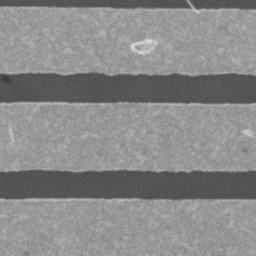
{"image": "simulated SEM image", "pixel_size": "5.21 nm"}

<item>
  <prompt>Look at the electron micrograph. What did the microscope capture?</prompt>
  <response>lines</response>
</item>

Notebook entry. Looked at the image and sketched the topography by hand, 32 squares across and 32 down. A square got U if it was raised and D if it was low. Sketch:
DDDDDDDDDDDDDDDDDDDDDDDDDDDDDDDD
UUUUUUUUUUUUUUUUUUUUUUUUUUUUUUUU
UUUUUUUUUUUUUUUUUUUUUUUUUUUUUUUU
UUUUUUUUUUUUUUUUUUUUUUUUUUUUUUUU
UUUUUUUUUUUUUUUUUUUUUUUUUUUUUUUU
UUUUUUUUUUUUUUUUUUUUUUUUUUUUUUUU
UUUUUUUUUUUUUUUUUUUUUUUUUUUUUUUU
UUUUUUUUUUUUUUUUUUUUUUUUUUUUUUUU
UUUUUUUUUUUUUUUUUUUUUUUUUUUUUUUU
DDDDDDDDDDDDDDDDDDDDDDDDDDDDDDDD
DDDDDDDDDDDDDDDDDDDDDDDDDDDDDDDD
DDDDDDDDDDDDDDDDDDDDDDDDDDDDDDDD
DDDDDDDDDDDDDDDDDDDDDDDDDDDDDDDD
UUUUUUUUUUUUUUUUUUUUUUUUUUUUUUUU
UUUUUUUUUUUUUUUUUUUUUUUUUUUUUUUU
UUUUUUUUUUUUUUUUUUUUUUUUUUUUUUUU
UUUUUUUUUUUUUUUUUUUUUUUUUUUUUUUU
UUUUUUUUUUUUUUUUUUUUUUUUUUUUUUUU
UUUUUUUUUUUUUUUUUUUUUUUUUUUUUUUU
UUUUUUUUUUUUUUUUUUUUUUUUUUUUUUUU
UUUUUUUUUUUUUUUUUUUUUUUUUUUUUUUU
DDDDDDDDDDDDDDDDDDDDDDDDDDDDDDDD
DDDDDDDDDDDDDDDDDDDDDDDDDDDDDDDD
DDDDDDDDDDDDDDDDDDDDDDDDDDDDDDDD
DDDDDDDDDDDDDDDDDDDDDDDDDDDDDDDD
UUUUUUUUUUUUUUUUUUUUUUUUUUUUUUUU
UUUUUUUUUUUUUUUUUUUUUUUUUUUUUUUU
UUUUUUUUUUUUUUUUUUUUUUUUUUUUUUUU
UUUUUUUUUUUUUUUUUUUUUUUUUUUUUUUU
UUUUUUUUUUUUUUUUUUUUUUUUUUUUUUUU
UUUUUUUUUUUUUUUUUUUUUUUUUUUUUUUU
UUUUUUUUUUUUUUUUUUUUUUUUUUUUUUUU